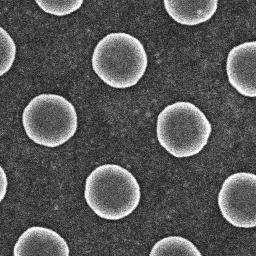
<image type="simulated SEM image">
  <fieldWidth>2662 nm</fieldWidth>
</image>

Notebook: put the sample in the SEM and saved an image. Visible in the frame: raised bodies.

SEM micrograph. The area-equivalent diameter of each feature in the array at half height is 550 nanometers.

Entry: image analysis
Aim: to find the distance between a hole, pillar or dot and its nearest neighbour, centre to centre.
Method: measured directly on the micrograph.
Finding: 964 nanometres